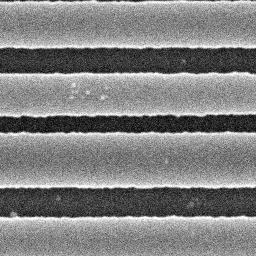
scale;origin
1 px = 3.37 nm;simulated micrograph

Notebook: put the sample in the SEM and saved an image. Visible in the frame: lines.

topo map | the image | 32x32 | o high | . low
oooooooooooooooooooooooooooooooo
oooooooooooooooooooooooooooooooo
oooooooooooooooooooooooooooooooo
oooooooooooooooooooooooooooooooo
oooooooooooooooooooooooooooooooo
oooooooooooooooooooooooooooooooo
................................
................................
................................
oooooooooooooooooooooooooooooooo
oooooooooooooooooooooooooooooooo
oooooooooooooooooooooooooooooooo
oooooooooooooooooooooooooooooooo
oooooooooooooooooooooooooooooooo
.oo.oo..........................
................................
................................
oooooooooooooooooooooooooooooooo
oooooooooooooooooooooooooooooooo
oooooooooooooooooooooooooooooooo
oooooooooooooooooooooooooooooooo
oooooooooooooooooooooooooooooooo
oooooooooooooooooooooooooooooooo
................................
................................
................................
................................
oooooooooooooooooooooooooooooooo
oooooooooooooooooooooooooooooooo
oooooooooooooooooooooooooooooooo
oooooooooooooooooooooooooooooooo
oooooooooooooooooooooooooooooooo